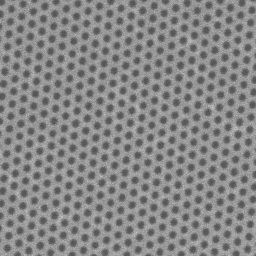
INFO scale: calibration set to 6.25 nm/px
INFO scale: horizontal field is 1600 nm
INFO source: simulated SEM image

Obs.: a regular array of holes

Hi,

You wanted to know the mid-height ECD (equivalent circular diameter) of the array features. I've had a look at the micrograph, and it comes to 47.3 nm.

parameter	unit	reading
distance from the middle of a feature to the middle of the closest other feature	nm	77.1